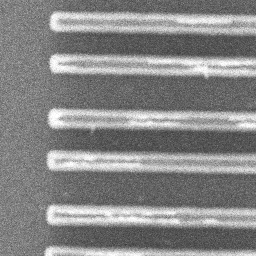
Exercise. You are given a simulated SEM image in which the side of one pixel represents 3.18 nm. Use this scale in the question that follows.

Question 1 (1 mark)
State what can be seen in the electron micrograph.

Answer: parallel lines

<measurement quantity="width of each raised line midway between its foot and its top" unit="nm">46.6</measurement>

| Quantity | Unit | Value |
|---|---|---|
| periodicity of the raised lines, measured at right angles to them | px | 48.6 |